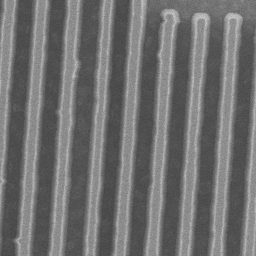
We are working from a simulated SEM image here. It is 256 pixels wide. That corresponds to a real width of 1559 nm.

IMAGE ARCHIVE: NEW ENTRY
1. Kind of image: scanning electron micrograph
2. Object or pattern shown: parallel lines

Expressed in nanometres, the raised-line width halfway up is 82.7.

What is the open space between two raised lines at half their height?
0.114 µm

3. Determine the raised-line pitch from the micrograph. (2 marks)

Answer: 32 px